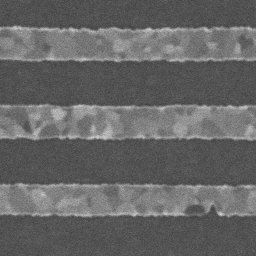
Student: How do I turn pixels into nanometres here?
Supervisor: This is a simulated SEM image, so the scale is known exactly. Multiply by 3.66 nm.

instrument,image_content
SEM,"one or a few lines or trenches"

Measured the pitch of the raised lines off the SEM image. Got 285 nm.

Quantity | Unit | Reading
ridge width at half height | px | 30.9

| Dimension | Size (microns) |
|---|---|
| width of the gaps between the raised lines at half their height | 0.171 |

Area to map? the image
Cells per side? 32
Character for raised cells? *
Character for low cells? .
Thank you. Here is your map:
................................
................................
................................
*****........................**.
********************************
********************************
********************************
...**.....*.*.**.*...*******...*
................................
................................
................................
................................
................................
********************************
********************************
********************************
********************************
................................
................................
................................
................................
................................
................................
********************************
********************************
********************************
**************************.*****
................................
................................
................................
................................
................................